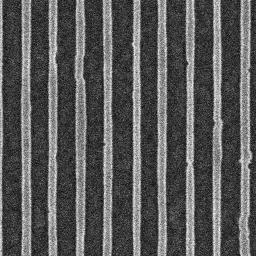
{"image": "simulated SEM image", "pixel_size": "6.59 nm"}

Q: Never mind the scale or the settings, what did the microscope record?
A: parallel lines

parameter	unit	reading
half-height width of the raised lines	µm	0.0461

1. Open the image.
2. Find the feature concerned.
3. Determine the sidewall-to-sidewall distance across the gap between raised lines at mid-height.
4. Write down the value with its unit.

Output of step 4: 138 nm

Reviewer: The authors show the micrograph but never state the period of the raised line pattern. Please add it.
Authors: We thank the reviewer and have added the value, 180 nm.